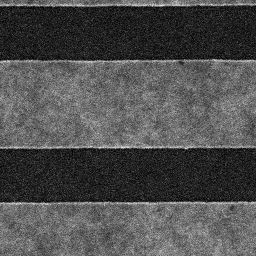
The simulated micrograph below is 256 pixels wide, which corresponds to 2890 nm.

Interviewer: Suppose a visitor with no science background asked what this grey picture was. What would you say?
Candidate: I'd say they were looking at one or a few lines or trenches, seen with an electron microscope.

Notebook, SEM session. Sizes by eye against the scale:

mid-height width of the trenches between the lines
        0.621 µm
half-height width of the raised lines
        87.2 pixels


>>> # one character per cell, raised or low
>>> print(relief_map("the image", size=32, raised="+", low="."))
++++++++++++++++++++++++++++++++
................................
................................
................................
................................
................................
................................
................................
++++++++++++++++++++++++++++++++
++++++++++++++++++++++++++++++++
++++++++++++++++++++++++++++++++
++++++++++++++++++++++++++++++++
++++++++++++++++++++++++++++++++
++++++++++++++++++++++++++++++++
++++++++++++++++++++++++++++++++
++++++++++++++++++++++++++++++++
++++++++++++++++++++++++++++++++
++++++++++++++++++++++++++++++++
+.++++.................+........
................................
................................
................................
................................
................................
................................
++++++++++++++++++++++++++++++++
++++++++++++++++++++++++++++++++
++++++++++++++++++++++++++++++++
++++++++++++++++++++++++++++++++
++++++++++++++++++++++++++++++++
++++++++++++++++++++++++++++++++
++++++++++++++++++++++++++++++++